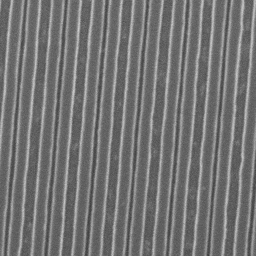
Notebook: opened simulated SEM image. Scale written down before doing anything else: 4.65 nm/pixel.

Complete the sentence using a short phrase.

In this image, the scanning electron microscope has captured parallel lines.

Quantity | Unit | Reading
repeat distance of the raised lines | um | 0.0939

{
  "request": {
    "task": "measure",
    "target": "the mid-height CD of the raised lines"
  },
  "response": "59.1 nm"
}